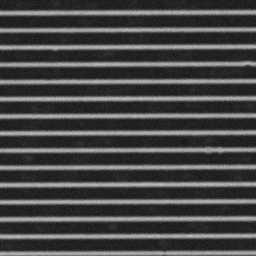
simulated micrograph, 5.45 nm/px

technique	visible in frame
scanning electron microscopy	parallel lines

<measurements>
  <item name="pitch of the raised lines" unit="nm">93.7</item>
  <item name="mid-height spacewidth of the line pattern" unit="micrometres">0.077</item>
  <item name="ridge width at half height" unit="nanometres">15.7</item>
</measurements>